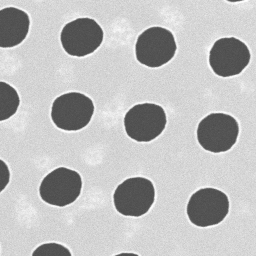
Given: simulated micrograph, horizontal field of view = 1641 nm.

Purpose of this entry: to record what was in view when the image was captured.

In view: a regular array of holes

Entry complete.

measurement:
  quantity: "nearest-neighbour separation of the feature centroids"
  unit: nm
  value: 474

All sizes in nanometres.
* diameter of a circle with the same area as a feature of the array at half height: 262